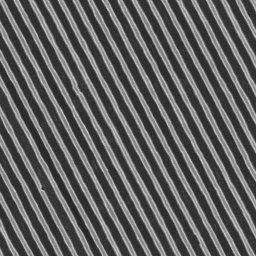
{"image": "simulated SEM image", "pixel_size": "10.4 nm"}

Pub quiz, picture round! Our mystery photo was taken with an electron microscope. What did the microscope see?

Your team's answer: parallel lines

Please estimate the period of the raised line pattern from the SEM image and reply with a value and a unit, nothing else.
136 nm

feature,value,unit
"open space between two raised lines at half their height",81.6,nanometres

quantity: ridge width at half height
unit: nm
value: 54.1